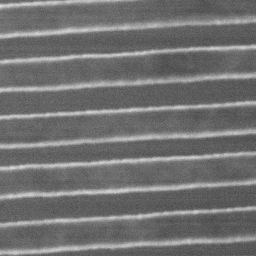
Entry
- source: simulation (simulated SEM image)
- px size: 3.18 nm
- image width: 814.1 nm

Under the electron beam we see lines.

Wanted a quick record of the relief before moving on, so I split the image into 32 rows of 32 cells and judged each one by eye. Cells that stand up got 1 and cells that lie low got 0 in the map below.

00011111111111111111111111111111
11111111111111111111111111111111
11111111111111111111111111111100
11111111111111000000000000000000
10000000000000000000000000000000
00000000000000000000000000000000
00000000000000000011111111111111
00001111111111111111111111111111
11111111111111111111111111111111
11111111111111111111111111110000
11111111111110000000000000000000
00000000000000000000000000000000
00000000000000000000000000000000
00000000000000000000011111111111
00011111111111111111111111111111
11111111111111111111111111111111
11111111111111111111111111111110
11111111111110000000000000000000
00000000000000000000000000000000
00000000000000000000000000111111
00000000000111111111111111111111
11111111111111111111111111111111
11111111111111111111111111111111
11111111111111111111100000000000
11000000000000000000000000000000
00000000000000000000000000000000
00000000000000000000000111111111
00000000011111111111111111111111
11111111111111111111111111111111
11111111111111111111111111111111
11111111111111111000000000000000
11100000000000000000000000000000